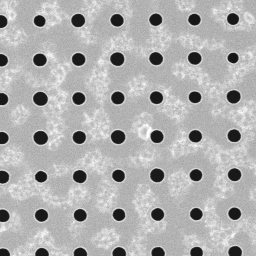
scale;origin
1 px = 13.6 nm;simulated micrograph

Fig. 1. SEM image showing a regular array of holes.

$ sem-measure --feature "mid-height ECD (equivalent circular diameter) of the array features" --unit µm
0.179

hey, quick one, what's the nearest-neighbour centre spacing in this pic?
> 522 nm